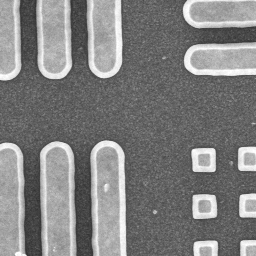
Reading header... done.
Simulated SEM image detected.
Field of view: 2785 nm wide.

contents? groups of lines, slits or small figures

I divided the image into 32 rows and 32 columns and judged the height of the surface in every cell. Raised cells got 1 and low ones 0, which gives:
11000111000111100000000111111111
11000111000111100000000111111111
11000111000111100000000011111111
11000111000111100000000000000000
11000111100111100000000000000000
11000111100111100000000000000000
11000111100111100000000011111111
11000111100111100000000111111111
11000111100011100000000011111111
10000010000000000000000000000000
00000000000000000000000000000000
00000000000000000000000000000000
00000000000000000000000000000000
00000000000000000000000000000000
00000000000000000000000000000000
00000000000000000000000000000000
00000000000000000000000000000000
00000000000000000000000000000000
11000011000011100000000000000000
11000111100011100000000011100011
11100111100011100000000011100011
11100111100011100000000000000000
11100111100011100000000000000000
11100111100011100000000000000000
11100111100011100000000000000000
11100111100011100000000011100011
11100111100011100000000011100011
11100111100011100000000000000000
11100011100011100000000000000000
11100111100011100000000000000000
11100011100011100000000001100001
11100011100011100000000001100011